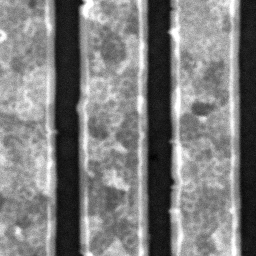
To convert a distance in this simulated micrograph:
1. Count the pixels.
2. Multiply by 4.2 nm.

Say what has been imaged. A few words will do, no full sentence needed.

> one or a few lines or trenches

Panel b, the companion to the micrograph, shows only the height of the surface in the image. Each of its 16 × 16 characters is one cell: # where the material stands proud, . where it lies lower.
###..####..####.
###..####..####.
###..####..####.
###..####..####.
###..####..####.
###..####..####.
###..####..####.
###..####..####.
###..####..####.
###..####..####.
###..####..####.
###..####..####.
###..####..####.
###..####..####.
###..####..####.
###..####..####.